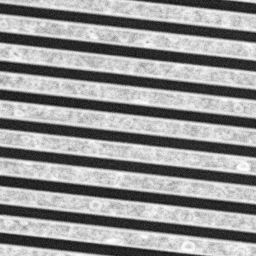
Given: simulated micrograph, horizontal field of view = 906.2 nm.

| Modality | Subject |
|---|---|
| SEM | parallel lines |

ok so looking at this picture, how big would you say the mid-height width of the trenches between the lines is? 12.3 pixels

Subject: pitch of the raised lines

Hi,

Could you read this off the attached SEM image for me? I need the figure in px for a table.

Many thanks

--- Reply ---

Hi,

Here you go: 28.5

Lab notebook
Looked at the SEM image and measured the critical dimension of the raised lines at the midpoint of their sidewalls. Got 0.0567 µm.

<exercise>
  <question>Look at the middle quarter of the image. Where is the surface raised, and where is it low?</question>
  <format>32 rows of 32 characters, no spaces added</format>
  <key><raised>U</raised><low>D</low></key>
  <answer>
UUUUUUUUUUUUUUUUUUUUUUUUUUUUUUUU
DDDDDDDDUUUUUUUUUUUUUUUUUUUUUUUU
DDDDDDDDDDDDDDDDDUUUUUUUUUUUUUUU
DDDDDDDDDDDDDDDDDDDDDDDDDDUUUUUU
UUUUUUDDDDDDDDDDDDDDDDDDDDDDDDDD
UUUUUUUUUUUUUUUDDDDDDDDDDDDDDDDD
UUUUUUUUUUUUUUUUUUUUUUUDDDDDDDDD
UUUUUUUUUUUUUUUUUUUUUUUUUUUUUUUU
DDDDDUUUUUUUUUUUUUUUUUUUUUUUUUUU
DDDDDDDDDDDDDDUUUUUUUUUUUUUUUUUU
DDDDDDDDDDDDDDDDDDDDDDDUUUUUUUUU
UUUDDDDDDDDDDDDDDDDDDDDDDDDDDDDU
UUUUUUUUUUUUDDDDDDDDDDDDDDDDDDDD
UUUUUUUUUUUUUUUUUUUUDDDDDDDDDDDD
UUUUUUUUUUUUUUUUUUUUUUUUUUUUUUDD
DDDDUUUUUUUUUUUUUUUUUUUUUUUUUUUU
DDDDDDDDDDDDDUUUUUUUUUUUUUUUUUUU
DDDDDDDDDDDDDDDDDDDDDDUUUUUUUUUU
UUDDDDDDDDDDDDDDDDDDDDDDDDDDDDUU
UUUUUUUUUUUDDDDDDDDDDDDDDDDDDDDD
UUUUUUUUUUUUUUUUUUUDDDDDDDDDDDDD
UUUUUUUUUUUUUUUUUUUUUUUUUUUUDDDD
DDDUUUUUUUUUUUUUUUUUUUUUUUUUUUUU
DDDDDDDDDDDDUUUUUUUUUUUUUUUUUUUU
DDDDDDDDDDDDDDDDDDDDDUUUUUUUUUUU
UDDDDDDDDDDDDDDDDDDDDDDDDDDDDDUU
UUUUUUUUUUDDDDDDDDDDDDDDDDDDDDDD
UUUUUUUUUUUUUUUUUUUDDDDDDDDDDDDD
UUUUUUUUUUUUUUUUUUUUUUUUUUUDDDDD
DDUUUUUUUUUUUUUUUUUUUUUUUUUUUUUU
DDDDDDDDDDDUUUUUUUUUUUUUUUUUUUUU
DDDDDDDDDDDDDDDDDDDDUUUUUUUUUUUU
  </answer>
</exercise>